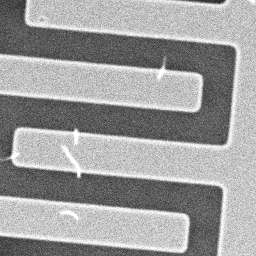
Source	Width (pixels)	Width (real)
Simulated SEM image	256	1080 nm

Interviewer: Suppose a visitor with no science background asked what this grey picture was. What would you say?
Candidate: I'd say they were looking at groups of lines, slits or small figures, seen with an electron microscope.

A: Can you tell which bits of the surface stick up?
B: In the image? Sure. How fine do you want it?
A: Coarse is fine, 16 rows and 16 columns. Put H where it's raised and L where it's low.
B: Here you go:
LLHHHHHHHHHHHHHH
LLHHHHHHHHHHHHHH
LLLLLLLLLLLHHHHH
HLLLLLLLLLLLLLLH
HHHHHHHHHHHHLLLH
HHHHHHHHHHHHHLLH
LLLLLLLHHHHHHLLH
LLLLLLLLLLLLLLHH
LHHHHHHLLLLLLLHH
LHHHHHHHHHHHHHHH
LLHHHHHHHHHHHHHH
LLLLLLLLLLLLLHHH
HHLLLLLLLLLLLLHH
HHHHHHHHHHHLLLHH
HHHHHHHHHHHHLLHH
LLLLLLLLHHHHLLHH